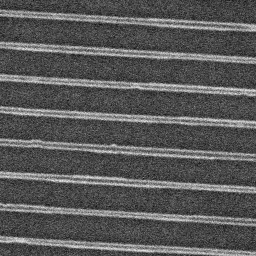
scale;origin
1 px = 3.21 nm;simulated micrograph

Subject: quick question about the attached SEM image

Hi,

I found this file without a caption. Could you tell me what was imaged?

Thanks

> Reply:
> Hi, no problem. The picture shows parallel lines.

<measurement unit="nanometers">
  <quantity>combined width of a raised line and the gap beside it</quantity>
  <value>104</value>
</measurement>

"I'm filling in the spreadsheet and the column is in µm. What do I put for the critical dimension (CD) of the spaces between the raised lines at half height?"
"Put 0.0877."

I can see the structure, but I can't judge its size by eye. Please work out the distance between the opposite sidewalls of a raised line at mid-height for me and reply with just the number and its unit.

17.6 nm